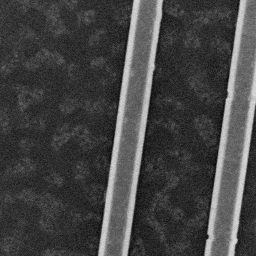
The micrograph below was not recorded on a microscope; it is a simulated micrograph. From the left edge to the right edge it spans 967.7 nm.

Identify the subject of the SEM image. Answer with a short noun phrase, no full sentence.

one or a few lines or trenches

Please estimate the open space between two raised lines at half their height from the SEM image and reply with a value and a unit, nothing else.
80.5 px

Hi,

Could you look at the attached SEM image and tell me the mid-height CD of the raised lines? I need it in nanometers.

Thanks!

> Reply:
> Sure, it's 94.1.